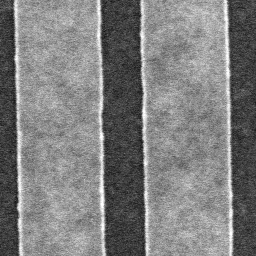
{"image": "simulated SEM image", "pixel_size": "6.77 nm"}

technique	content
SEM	one or a few lines or trenches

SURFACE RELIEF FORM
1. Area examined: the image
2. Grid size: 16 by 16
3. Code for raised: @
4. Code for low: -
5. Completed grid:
-@@@@@---@@@@@--
-@@@@@---@@@@@--
-@@@@@---@@@@@--
-@@@@@---@@@@@--
-@@@@@---@@@@@--
-@@@@@---@@@@@--
-@@@@@---@@@@@--
-@@@@@---@@@@@--
-@@@@@---@@@@@--
-@@@@@---@@@@@--
-@@@@@---@@@@@--
-@@@@@---@@@@@--
-@@@@@---@@@@@--
-@@@@@---@@@@@--
-@@@@@---@@@@@--
-@@@@@@--@@@@@--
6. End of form